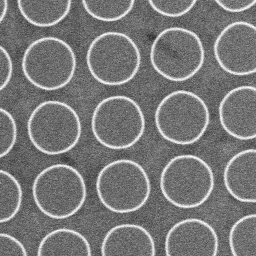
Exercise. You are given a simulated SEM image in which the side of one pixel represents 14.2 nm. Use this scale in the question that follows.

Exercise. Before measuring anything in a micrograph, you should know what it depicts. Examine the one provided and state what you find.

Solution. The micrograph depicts an array of small figures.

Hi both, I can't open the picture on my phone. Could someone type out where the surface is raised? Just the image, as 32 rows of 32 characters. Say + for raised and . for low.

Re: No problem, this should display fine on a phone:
+.+++++++..++++++..+++++...+++++
+..+++++...+++++....+++.........
...++++......+..................
............................++++
.............+++....+++++..+++++
....++++....+++++..++++++..+++++
+..++++++..++++++..++++++..+++++
+..++++++..++++++..++++++..+++++
+..++++++..++++++..++++++...++++
+..++++++...+++++....+++........
+...++++......+.................
......................+......+++
.............+++.....++++...++++
.....++++...+++++...++++++..++++
+...++++++..++++++..++++++..++++
++..++++++..++++++..++++++..++++
++..++++++..++++++..+++++....+++
++..++++++..+++++....++++.......
+....++++.....+.................
.......................+.....+++
..............+++....+++++...+++
+....+++++...+++++..++++++..++++
++..++++++..++++++..+++++++.++++
++..+++++++.+++++++.++++++..++++
+++.+++++++.++++++...+++++...+++
++...+++++...+++++....+++.......
++...++++.......................
+.......................+.....++
..............++++....++++...+++
+.....++++...++++++..++++++..+++
+++..++++++..++++++..++++++..+++
+++..++++++..++++++..++++++..+++